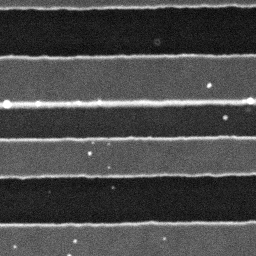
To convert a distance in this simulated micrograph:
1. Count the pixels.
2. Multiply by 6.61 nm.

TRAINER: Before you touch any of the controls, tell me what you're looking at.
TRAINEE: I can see lines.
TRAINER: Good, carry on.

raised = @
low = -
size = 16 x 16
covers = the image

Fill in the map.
@@@@@@@@@-------
----------------
----------------
---------@@@@@@@
@@@@@@@@@@@@@@@@
@@@@@@@@@@@@@@@@
@@@@@@@@@@@@@@@@
----------------
----------------
@@@@@@@@@@@@@@@@
@@@@@@@@@@@@@@@@
----------------
----------------
----------------
@@@@@@@@@@@@@@@@
@@@@@@@@@@@@@@@@